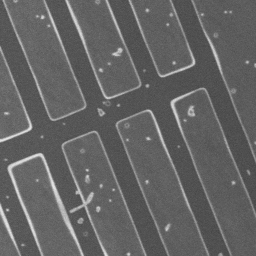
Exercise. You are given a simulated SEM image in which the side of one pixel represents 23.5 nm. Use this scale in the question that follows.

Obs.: groups of lines, slits or small figures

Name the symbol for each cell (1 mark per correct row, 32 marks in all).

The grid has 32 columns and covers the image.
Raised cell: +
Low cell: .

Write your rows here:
.+++++..++++++..++++++..++++++++
.+++++...+++++...+++++...+++++++
.++++++..+++++...+++++...+++++++
..+++++...+++++..++++++..+++++++
..+++++...+++++...+++++...++++++
...+++++...+++++..++++++..++++++
...+++++...+++++...+++++...+++++
+..++++++..+++++...+++++...+++++
+...+++++...+++++...+++....+++++
+...+++++...+++++...........++++
++...+++++..++++++..........++++
++...+++++...+++........++...+++
+++..++++++...........++++...+++
+++...++++............+++++..+++
+++...++.........++...+++++...++
++++...........+++++..+++++...++
+++........+...+++++...+++++...+
.........++++..+++++...+++++...+
........+++++...+++++...+++++..+
....+...+++++...+++++...+++++...
..++++..++++++..++++++..+++++...
.+++++...+++++...+++++...+++++..
..++++...++++++..+++++...+++++..
..+++++...+++++...+++++..++++++.
..+++++...+++++...+++++...+++++.
...+++++..++++++..++++++..+++++.
...+++++...+++++...+++++...+++++
+...++++...++++++..+++++...+++++
+...+++++...+++++...+++++..+++++
+...+++++...+++++...+++++...++++
++...+++++...+++++..++++++..++++
++...+++++...+++++...+++++...+++